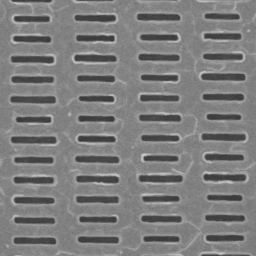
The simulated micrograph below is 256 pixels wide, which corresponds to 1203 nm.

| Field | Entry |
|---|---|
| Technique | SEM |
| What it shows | a regular array of holes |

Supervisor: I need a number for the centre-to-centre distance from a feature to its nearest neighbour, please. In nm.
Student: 94.5